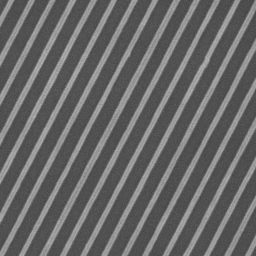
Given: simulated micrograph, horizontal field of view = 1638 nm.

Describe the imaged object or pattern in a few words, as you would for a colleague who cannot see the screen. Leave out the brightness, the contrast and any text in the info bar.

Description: parallel lines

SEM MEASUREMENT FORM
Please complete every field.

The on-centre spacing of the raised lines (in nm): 117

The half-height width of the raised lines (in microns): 0.027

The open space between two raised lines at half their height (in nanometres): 91.4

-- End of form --